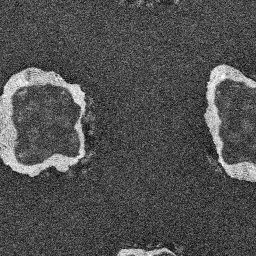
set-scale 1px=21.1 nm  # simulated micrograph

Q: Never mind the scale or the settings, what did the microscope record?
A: raised bodies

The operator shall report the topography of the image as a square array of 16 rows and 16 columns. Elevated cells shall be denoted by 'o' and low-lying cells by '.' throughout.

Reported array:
................
................
................
................
................
.oooo........ooo
ooooo........ooo
ooooo........ooo
ooooo.........oo
.oooo.........oo
.o.............o
................
................
................
................
................